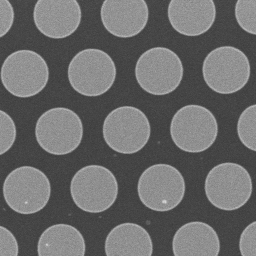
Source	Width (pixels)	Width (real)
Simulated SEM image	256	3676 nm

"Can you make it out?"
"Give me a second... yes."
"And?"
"an array of small figures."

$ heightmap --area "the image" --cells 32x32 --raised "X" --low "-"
X----XXXXX---XXXXX---XXXXXX---XX
XX--XXXXXX---XXXXX---XXXXXX--XXX
XX--XXXXXX---XXXXX---XXXXXX---XX
X----XXXXX---XXXXX----XXXX----XX
------XX-------X----------------
--------------------------------
--XX------XXX-----XXXX----XXXX--
-XXXX----XXXXX---XXXXX----XXXXX-
XXXXXX---XXXXX---XXXXXX--XXXXXX-
XXXXXX---XXXXX---XXXXXX--XXXXXX-
XXXXXX---XXXXX---XXXXX----XXXXX-
-XXXX-----XXX------XX------XX---
--------------------------------
---------------XX------XXX-----X
X----XXXXX---XXXXX----XXXXX---XX
XX---XXXXX---XXXXXX--XXXXXX---XX
XX--XXXXXX---XXXXXX--XXXXXX---XX
XX---XXXXX---XXXXX----XXXXX---XX
X----XXXX-----XXXX-----XXX-----X
--------------------------------
----------------------------XX--
-XXXX-----XXXX----XXXX----XXXXX-
-XXXXX---XXXXX---XXXXXX---XXXXX-
XXXXXX---XXXXXX--XXXXXX---XXXXX-
XXXXXX---XXXXXX--XXXXXX---XXXXX-
-XXXXX----XXXX----XXXX-----XXX--
--XX-------XX-------------------
--------------------------------
X-----XXX-----XXXX-----XXX-----X
XX---XXXXX---XXXXXX---XXXXX---XX
XX---XXXXXX--XXXXXX---XXXXX---XX
XX---XXXXXX--XXXXXX---XXXXX---XX